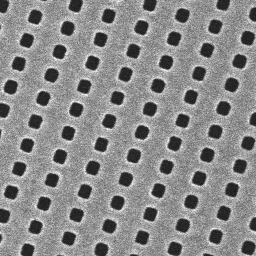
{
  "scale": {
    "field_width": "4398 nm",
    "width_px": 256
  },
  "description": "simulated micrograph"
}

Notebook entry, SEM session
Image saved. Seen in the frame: a regular array of holes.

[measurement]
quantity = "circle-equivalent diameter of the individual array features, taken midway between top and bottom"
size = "14.9 px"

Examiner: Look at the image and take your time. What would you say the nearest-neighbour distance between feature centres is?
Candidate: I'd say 425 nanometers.